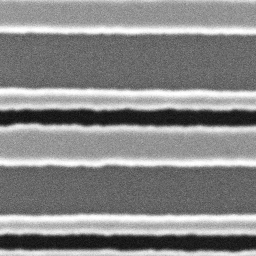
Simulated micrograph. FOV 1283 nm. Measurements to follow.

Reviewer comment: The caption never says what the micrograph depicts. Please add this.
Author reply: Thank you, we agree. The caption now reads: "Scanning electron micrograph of lines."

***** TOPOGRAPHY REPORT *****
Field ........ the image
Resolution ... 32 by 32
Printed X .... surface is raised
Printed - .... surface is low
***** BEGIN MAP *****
XXXXXXXXXXXXXXXXXXXXXXXXXXXXXXXX
XXXXXXXXXXXXXXXXXXXXXXXXXXXXXXXX
XXXXXXXXXXXXXXXXXXXXXXXXXXXXXXXX
XXXXXXXXXXXXXXXXXXXXXXXXXXXXXXXX
--------------------------------
--------------------------------
--------------------------------
--------------------------------
--------------------------------
--------------------------------
--------------------------------
XXXX-XXXXX-X--------------------
XXXXXXXXXXXXXXXXXXXXXXXXXXXXXXXX
X-X-XX-----XXXX--XXX--XXX-XXX-XX
--------------------------------
--------------------------------
XXXXXXXXXXXXXXXXXXXXXXXXXXXXXXXX
XXXXXXXXXXXXXXXXXXXXXXXXXXXXXXXX
XXXXXXXXXXXXXXXXXXXXXXXXXXXXXXXX
XXXXXXXXXXXXXXXXXXXXXXXXXXXXXXXX
--------------------------------
--------------------------------
--------------------------------
--------------------------------
--------------------------------
--------------------------------
--------------------------------
XXXXXXXXXXXXXXXXXXXXXXXXXXXXXXXX
XXXXXXXXXXXXXXXXXXXXXXXXXXXXXXXX
--------------------------------
--------------------------------
XXXXXXXXXXXXXXXXXXXXXXX-------XX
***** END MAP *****